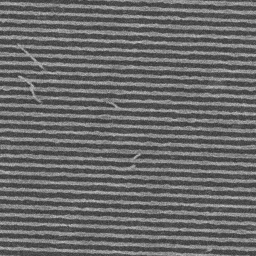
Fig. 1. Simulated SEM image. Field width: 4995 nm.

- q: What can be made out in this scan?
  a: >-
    parallel lines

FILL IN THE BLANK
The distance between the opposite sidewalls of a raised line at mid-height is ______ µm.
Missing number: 0.0512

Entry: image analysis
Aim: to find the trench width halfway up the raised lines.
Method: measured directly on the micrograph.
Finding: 102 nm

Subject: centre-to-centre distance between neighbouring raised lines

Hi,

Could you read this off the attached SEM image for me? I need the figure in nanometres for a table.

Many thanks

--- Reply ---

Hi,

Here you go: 164